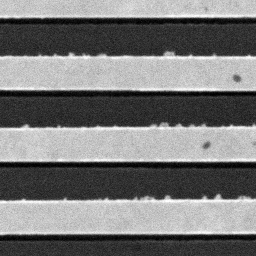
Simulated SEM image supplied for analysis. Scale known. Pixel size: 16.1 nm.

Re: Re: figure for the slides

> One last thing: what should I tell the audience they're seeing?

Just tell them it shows lines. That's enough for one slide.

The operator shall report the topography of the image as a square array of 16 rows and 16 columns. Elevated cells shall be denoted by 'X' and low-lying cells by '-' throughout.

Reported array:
XXXXXXXXXXXXXXXX
----------------
----------------
----------------
XXXXXXXXXXXXXXXX
XXXXXXXXXXXXXXXX
----------------
----------------
XXXXXXXXXXXXXXXX
XXXXXXXXXXXXXXXX
----------------
----------------
---------------X
XXXXXXXXXXXXXXXX
XXXXXXXXXXXXXXXX
----------------